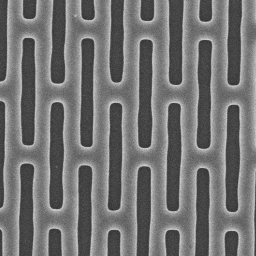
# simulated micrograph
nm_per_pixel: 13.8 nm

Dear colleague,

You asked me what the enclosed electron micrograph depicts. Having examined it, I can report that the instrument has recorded groups of lines, slits or small figures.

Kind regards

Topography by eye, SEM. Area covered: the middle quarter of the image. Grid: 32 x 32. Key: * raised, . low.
****....***....****...****....**
****....***....****...****....**
****....***....****...****....**
****....****...****...****....**
****....****..*****...****...***
****....***********...**********
****...************...**********
****...************...**********
****...************...**********
****...************...*****.****
****....***...*****...****...***
****....***....****...****...***
****....***....****...****...***
****....***....***....****...***
****...****...****....****...***
****...****...****....****...***
****...****...****....****...***
****...****....***....****...***
****...****....****...****...***
****...****....****...****...***
*****..****....****...****...***
***********....***********...***
***********....***********...***
***********....***********...***
***********....***********...***
****..*****...*****..*****...***
****...****...*****...****...***
****...****...****....***....***
****...****...****....***....***
****...****...****....***....***
****...****...****....***....***
****...****...****....***....***